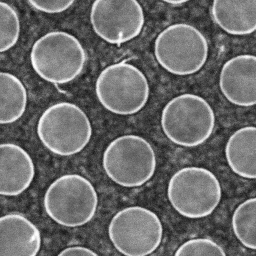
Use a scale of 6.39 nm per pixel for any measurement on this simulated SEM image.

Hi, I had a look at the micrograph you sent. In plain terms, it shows a regular array of raised bodies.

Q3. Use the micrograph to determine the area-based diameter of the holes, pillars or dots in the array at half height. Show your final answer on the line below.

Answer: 0.319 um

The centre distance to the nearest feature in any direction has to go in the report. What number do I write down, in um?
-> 0.452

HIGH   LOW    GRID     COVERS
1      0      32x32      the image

10001111100011111000000000011111
11000010000011111100000000011111
11000000000111111100000000011111
11000000000011111100011100001111
11000011100001111000111110000000
11001111110000000000111111000000
00001111110000000001111111000000
00001111110000000000111111000111
00001111110000111000011110001111
10000111100001111100000000001111
11100000000011111100000000001111
11100000000011111100000000001111
11100000000001111100001110000111
11100011110001111000011111000000
11000111111000000000111111100000
00000111111000000000111111100000
00000111111000000000011111000011
00000111111000011100001110000111
11000011110000111110000000001111
11100000000001111110000000001111
11110000000001111110000000000111
11110000000001111110001111000011
11110001111000111100011111100000
11100011111100000000011111100000
00000011111100000000011111100000
00000011111100000000001111100011
00000011111100011110000111000111
11100001111000111111000000000111
11110000000000111111000000000111
11111000000000111111000000000011
11111000000000111111000111100001
11111000111000011110001111110000